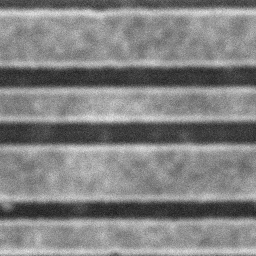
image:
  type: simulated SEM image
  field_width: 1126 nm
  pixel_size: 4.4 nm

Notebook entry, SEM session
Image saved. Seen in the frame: one or a few lines or trenches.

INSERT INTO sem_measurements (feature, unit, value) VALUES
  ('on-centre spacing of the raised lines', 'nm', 292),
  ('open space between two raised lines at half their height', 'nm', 115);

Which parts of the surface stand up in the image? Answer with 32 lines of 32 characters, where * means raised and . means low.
................................
....**..........**.........*****
********************************
********************************
********************************
********************************
********************************
********************************
................................
................................
................................
********************************
********************************
********************************
********************************
................................
................................
................................
......*.*....**....*************
********************************
********************************
********************************
********************************
********************************
********************************
................................
................................
................................
********************************
********************************
********************************
***********.....................